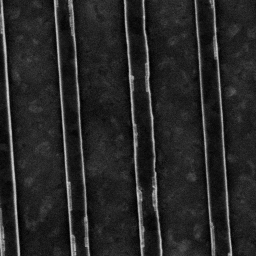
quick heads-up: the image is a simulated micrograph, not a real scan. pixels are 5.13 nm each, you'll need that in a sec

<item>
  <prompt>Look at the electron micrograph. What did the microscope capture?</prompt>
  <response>one or a few lines or trenches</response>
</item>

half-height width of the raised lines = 0.0941 um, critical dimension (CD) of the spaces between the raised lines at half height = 268 nm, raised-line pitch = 361 nm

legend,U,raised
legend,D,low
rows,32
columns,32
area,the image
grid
DDDDDDDUUDDDDDDDUUDDDDDDUUUDDDDD
DDDDDDDUUDDDDDDDUUDDDDDDUUUDDDDD
DDDDDDDUUDDDDDDDUUDDDDDDDUUDDDDD
DDDDDDDUUDDDDDDDUUDDDDDDDUUDDDDD
UDDDDDDUUDDDDDDDUUDDDDDDDUUDDDDD
UDDDDDDUUDDDDDDDUUDDDDDDDUUDDDDD
UDDDDDDUUDDDDDDDUUDDDDDDDUUDDDDD
UDDDDDDUUDDDDDDDUUUDDDDDDUUDDDDD
UDDDDDDUUUDDDDDDUUUDDDDDDUUDDDDD
UDDDDDDUUUDDDDDDUUUDDDDDDUUDDDDD
UDDDDDDDUUDDDDDDUUDDDDDDDUUDDDDD
UDDDDDDDUUDDDDDDUUUDDDDDDUUUDDDD
UDDDDDDDUUDDDDDDDUUDDDDDDUUUDDDD
UDDDDDDDUUDDDDDDDUUDDDDDDUUUDDDD
UDDDDDDDUUDDDDDDDUUDDDDDDUUUDDDD
UDDDDDDDUUDDDDDDDUUDDDDDDUUUDDDD
UDDDDDDDUUDDDDDDDUUDDDDDDDUUDDDD
UDDDDDDDUUDDDDDDDUUDDDDDDDUUDDDD
UDDDDDDDUUDDDDDDDUUDDDDDDDUUDDDD
UUDDDDDDUUDDDDDDDUUDDDDDDDUUDDDD
UUDDDDDDUUDDDDDDDUUDDDDDDDUUDDDD
UUDDDDDDUUDDDDDDDUUDDDDDDDUUDDDD
UUDDDDDDUUDDDDDDDUUDDDDDDDUUDDDD
UUDDDDDDUUUDDDDDDUUDDDDDDDUUDDDD
UUDDDDDDUUUDDDDDDUUUDDDDDDUUDDDD
UUDDDDDDDUUDDDDDDUUUDDDDDDUUDDDD
UUDDDDDDDUUDDDDDDUUUDDDDDDUUDDDD
UUDDDDDDDUUDDDDDDUUUDDDDDDUUDDDD
UUDDDDDDDUUDDDDDDUUUDDDDDDUUUDDD
UUDDDDDDDUUDDDDDDDUUDDDDDDUUUDDD
UUDDDDDDDUUDDDDDDDUUDDDDDDUUUDDD
UUDDDDDDDUUDDDDDDDUUDDDDDDDUUDDD